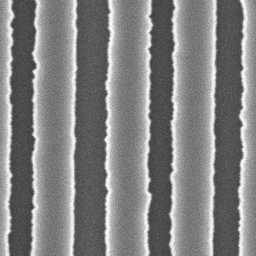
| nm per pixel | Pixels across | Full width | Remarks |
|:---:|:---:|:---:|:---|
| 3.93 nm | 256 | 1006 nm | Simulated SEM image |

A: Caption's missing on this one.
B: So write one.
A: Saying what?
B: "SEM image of lines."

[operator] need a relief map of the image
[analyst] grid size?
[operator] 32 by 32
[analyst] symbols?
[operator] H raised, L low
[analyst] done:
HLLLLHHHHHLLLLHHHHHLLLHHHHHLLLHH
HHLLHHHHHLLLLLHHHHHLLLHHHHHLLLHH
HHLLHHHHHLLLLLHHHHHLLLHHHHHLLLLH
HLLLHHHHHHLLLLHHHHHLLLHHHHHLLLHH
HHLLHHHHHHLLLLHHHHHLLLHHHHHLLLHH
HHLLHHHHHLLLLLHHHHHLLLHHHHHLLLHH
HLLLHHHHHLLLLLHHHHHLLLHHHHHLLLHH
HLLLHHHHHLLLLLHHHHHLLLHHHHHLLLHH
HLLLHHHHHHLLLLHHHHHLLLHHHHHLLLHH
HLLLHHHHHLLLLLHHHHHLLLHHHHHLLLHH
HLLLHHHHHLLLLHHHHHHLLLHHHHHLLLHH
HLLLHHHHHLLLLHHHHHHLLLHHHHHLLLHH
HLLLHHHHHLLLLHHHHHHLLLHHHHHLLLHH
HLLLHHHHHLLLLHHHHHHLLLHHHHHLLLHH
HLLLHHHHHLLLLLHHHHHLLLHHHHHLLLHH
HLLLHHHHHLLLLHHHHHHLLHHHHHHLLLHH
HLLLHHHHHLLLLHHHHHHLLLHHHHHLLLHH
HLLLHHHHHLLLLHHHHHHLLLHHHHHLLLHH
HLLLHHHHHLLLLHHHHHHLLLHHHHHLLLHH
HLLLHHHHHLLLLHHHHHHLLLHHHHHLLLHH
HLLLHHHHHLLLLHHHHHLLLLHHHHHLLLHH
HLLLHHHHHLLLLHHHHHHLLHHHHHHLLLHH
HLLLHHHHHLLLLHHHHHHLLHHHHHHLLLHH
HLLLHHHHHLLLLHHHHHHLLLHHHHHLLLHH
HLLLHHHHHLLLLHHHHHHLLHHHHHHLLLHH
HLLLHHHHHLLLLHHHHHHLLLHHHHHLLLHH
HLLLHHHHHLLLLHHHHHHLLHHHHHHLLLHH
HLLLHHHHHLLLLHHHHHLLLHHHHHHLLLHH
HLLLHHHHHLLLLHHHHHHLLHHHHHHLLLHH
HLLLHHHHHLLLLHHHHHLLLHHHHHHLLLHH
HLLLHHHHHLLLLHHHHHHLLHHHHHHLLLHH
HLLLHHHHHLLLLHHHHHHLLHHHHHHLLLHH